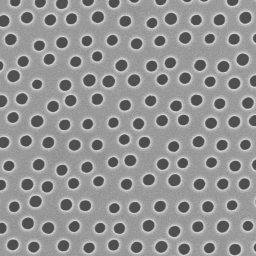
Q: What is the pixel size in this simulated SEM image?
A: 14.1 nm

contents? a regular array of holes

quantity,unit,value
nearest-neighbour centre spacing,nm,292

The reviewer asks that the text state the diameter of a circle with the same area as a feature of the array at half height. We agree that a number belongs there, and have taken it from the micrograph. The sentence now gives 161 nm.